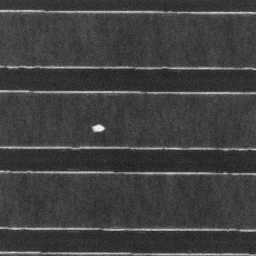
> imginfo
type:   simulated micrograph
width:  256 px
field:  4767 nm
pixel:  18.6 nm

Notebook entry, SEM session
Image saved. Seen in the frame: lines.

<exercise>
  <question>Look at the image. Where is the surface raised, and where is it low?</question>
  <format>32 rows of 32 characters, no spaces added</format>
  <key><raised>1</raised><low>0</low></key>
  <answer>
00000000000000000000000000000000
11111111111111111000000000000000
11111111111111111111111111111111
11111111111111111111111111111111
11111111111111111111111111111111
11111111111111111111111111111111
11111111111111111111111111111111
11111111111111111111111111111111
00000000000000000000011111111111
00000000000000000000000000000000
00000000000000000000000000000000
00000000000000000000000000000000
11111111111111111111111111111111
11111111111111111111111111111111
11111111111111111111111111111111
11111111111111111111111111111111
11111111111111111111111111111111
11111111111111111111111111111111
00000000000000000001011111111111
00000000000000000000000000000000
00000000000000000000000000000000
00000000000000000000000000000000
11111111111111111111111111111111
11111111111111111111111111111111
11111111111111111111111111111111
11111111111111111111111111111111
11111111111111111111111111111111
11111111111111111111111111111111
11111111111111111111111111111111
00000000000000000000000000000000
00000000000000000000000000000000
00000000000000000000000000000000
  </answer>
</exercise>